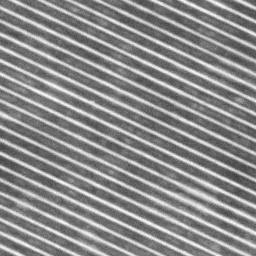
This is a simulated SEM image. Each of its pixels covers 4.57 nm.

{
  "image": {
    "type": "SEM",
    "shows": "parallel lines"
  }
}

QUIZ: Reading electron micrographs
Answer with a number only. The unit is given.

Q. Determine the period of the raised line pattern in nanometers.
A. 54.8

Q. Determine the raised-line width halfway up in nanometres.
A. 8.8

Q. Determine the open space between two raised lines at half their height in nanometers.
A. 47.1